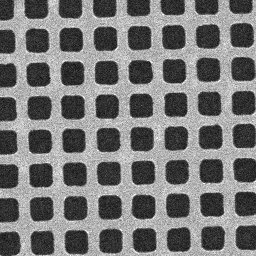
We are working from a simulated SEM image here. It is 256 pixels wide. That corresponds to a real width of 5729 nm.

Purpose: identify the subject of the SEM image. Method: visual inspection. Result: a regular array of holes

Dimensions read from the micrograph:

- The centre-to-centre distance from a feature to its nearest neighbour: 751 nm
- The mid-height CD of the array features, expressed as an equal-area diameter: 575 nanometres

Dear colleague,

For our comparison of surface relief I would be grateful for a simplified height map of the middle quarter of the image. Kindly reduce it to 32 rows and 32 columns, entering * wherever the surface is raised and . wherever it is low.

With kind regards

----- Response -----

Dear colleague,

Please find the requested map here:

.....***.....***......***......*
.....***.....***......***......*
.....***......**......***......*
.....***......**......***.....**
.....***.....****....****.....**
.*******************************
********************************
**********..******...*****....**
.....***.....****.....***......*
.....***......**......***......*
.....***......**......***......*
.....***......**......***......*
.....***......**......***......*
.....****....******.************
********************************
**************************...***
....****.....****.....***......*
.....***......**.......**......*
......**......**.......**......*
......**......**.......**......*
......**......***.....***......*
.....****....****.....****....**
********************************
********************************
**..******...*****....****.....*
.....***......***......**......*
......**......***......**......*
......**......***......**......*
......**......***......**......*
......***.....***.....****.....*
****.***************************
********************************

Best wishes